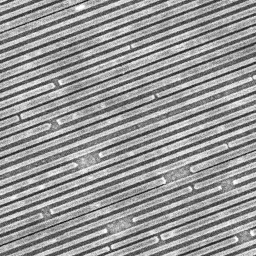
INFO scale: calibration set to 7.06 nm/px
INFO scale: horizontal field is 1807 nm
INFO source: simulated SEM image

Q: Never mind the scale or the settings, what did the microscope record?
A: parallel lines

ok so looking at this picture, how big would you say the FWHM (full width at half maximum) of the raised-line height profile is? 35.5 nm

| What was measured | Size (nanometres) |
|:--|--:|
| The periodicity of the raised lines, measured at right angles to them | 63.9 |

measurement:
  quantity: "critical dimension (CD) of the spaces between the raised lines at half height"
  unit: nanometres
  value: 29.8